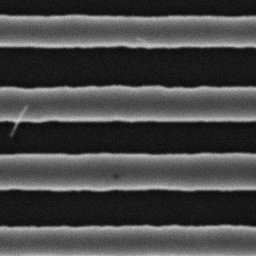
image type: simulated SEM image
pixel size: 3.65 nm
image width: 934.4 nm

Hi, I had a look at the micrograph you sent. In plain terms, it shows lines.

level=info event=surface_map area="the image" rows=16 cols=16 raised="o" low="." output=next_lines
................
oooooooooooooooo
oooooooooooooooo
................
................
o..ooooooooooooo
oooooooooooooooo
oooooooooooooooo
................
................
oooooooooooooooo
oooooooooooooooo
................
................
oooooooooooooooo
oooooooooooooooo